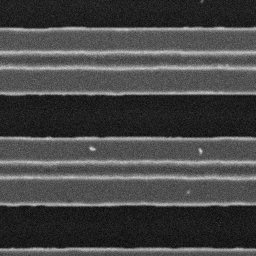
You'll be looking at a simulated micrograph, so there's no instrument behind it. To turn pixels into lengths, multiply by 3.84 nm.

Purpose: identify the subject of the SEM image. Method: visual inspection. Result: lines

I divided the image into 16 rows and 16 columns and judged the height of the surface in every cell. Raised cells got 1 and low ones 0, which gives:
0000000000000000
0000000000000000
1111111111111111
1111111111111111
1111111111111111
1111111111111111
0000000000000000
0000000000000000
0000000000000000
1111111111111111
1111111111111111
1111111111111111
1111111111111111
0000000000000000
0000000000000000
0000000000000000